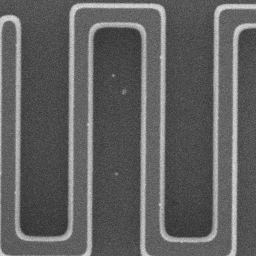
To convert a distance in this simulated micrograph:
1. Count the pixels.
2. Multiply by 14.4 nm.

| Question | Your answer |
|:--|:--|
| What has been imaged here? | groups of lines, slits or small figures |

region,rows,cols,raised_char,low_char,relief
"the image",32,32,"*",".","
................................
.........***********.......*****
**.......***********.......*****
**.......***.....***.......***..
**.......**.......**.......***..
**.......**.......**.......**...
**.......**.......**.......**...
**.......**.......**.......**...
**.......**.......**.......**...
**.......**.......**.......**...
**.......**.......**.......**...
**.......**.......**.......**...
**.......**.......**.......**...
**.......**.......**.......**...
**.......**.......**.......**...
**.......**.......**.......**...
**.......**.......**.......**...
**.......**.......**.......**...
**.......**.......**.......**...
**.......**.......**.......**...
**.......**.......**.......**...
**.......**.......**.......**...
**.......**.......**.......**...
**.......**.......**.......**...
**.......**.......**.......**...
**.......**.......**.......**...
**.......**.......**.......**...
**.......**.......**.......**...
**.......**.......**.......**...
***.....***.......***.....***...
***********.......***********...
***********.......***********...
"